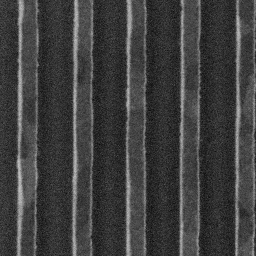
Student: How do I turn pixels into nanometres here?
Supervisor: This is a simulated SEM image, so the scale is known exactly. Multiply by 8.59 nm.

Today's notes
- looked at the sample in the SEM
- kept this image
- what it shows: lines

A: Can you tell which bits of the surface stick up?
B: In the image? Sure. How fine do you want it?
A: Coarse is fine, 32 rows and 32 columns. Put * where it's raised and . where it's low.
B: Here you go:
...**.....**....**.....**.....**
...**.....**....**.....**.....**
...**.....**....**.....**.....**
...**.....**....**.....**.....**
...**.....**....**.....**.....**
...**.....**....**.....**.....**
...**....***....**.....**.....**
..***.....**....**.....**.....**
...**.....**....**.....**.....**
...**.....**....**.....**.....**
...**....**.....**.....**.....**
...**....**.....**.....**.....**
...**....**.....**.....**.....**
...**....***....**.....**.....**
..***....***....**.....**.....**
..***....***....**.....**.....**
..***....***....**.....**.....**
..***....***....**.....**.....**
..***....***....**.....**.....**
..***....***....**.....**.....**
..**.....***....**.....**.....**
..***....**.....**.....**.....**
..***....**.....**.....**.....**
...**....**.....**.....**.....**
...*.....**.....**.....**.....**
...*.....**.....**.....**.....**
...*.....**.....**.....**.....**
..**.....**.....**.....**.....**
..**.....**.....**.....**.....**
..**.....**.....**.....**.....**
..**.....**.....**.....**.....**
..**.....**.....**.....**.....**